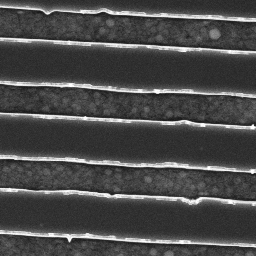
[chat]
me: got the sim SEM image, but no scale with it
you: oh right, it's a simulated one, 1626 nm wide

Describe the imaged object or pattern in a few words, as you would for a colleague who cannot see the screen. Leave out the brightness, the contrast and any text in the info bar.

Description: one or a few lines or trenches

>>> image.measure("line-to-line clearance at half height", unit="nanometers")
188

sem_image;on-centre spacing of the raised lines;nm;476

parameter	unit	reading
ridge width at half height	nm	291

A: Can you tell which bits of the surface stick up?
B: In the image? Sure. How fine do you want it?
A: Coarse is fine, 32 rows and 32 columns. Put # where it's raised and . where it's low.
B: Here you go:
################################
.....##..#######################
.............................###
................................
................................
##############..................
################################
################################
################################
################################
################################
.................###############
................................
................................
########........................
##########################......
################################
################################
################################
################################
............#.##################
...............................#
................................
................................
##################..............
################################
################################
################################
################################
......##########################
..........................######
................................